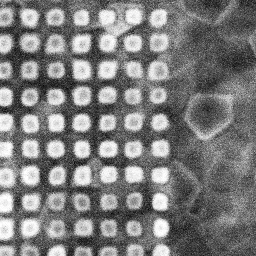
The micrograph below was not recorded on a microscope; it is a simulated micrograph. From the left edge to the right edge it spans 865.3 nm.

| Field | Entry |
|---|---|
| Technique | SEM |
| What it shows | a regular array of raised bodies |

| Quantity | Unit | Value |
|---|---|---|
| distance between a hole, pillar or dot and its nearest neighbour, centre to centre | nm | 85.9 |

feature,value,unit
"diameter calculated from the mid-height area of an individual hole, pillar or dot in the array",51.2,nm